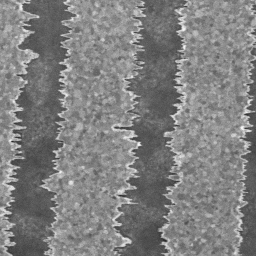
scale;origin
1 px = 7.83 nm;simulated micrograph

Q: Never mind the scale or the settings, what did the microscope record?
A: one or a few lines or trenches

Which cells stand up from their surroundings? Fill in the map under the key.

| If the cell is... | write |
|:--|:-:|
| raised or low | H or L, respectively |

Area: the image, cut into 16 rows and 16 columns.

HHLLHHHHHLLHHHHH
HHLLHHHHHLLHHHHH
HLLLHHHHHLLHHHHH
HHLLHHHHHLLHHHHH
HLLLHHHHLLLHHHHH
HLLLHHHHLLLHHHHH
HLLLHHHHLLLHHHHH
HLLLHHHHLLLHHHHL
HLLLHHHHLLLHHHHL
HLLLHHHHLLLHHHHL
HLLLHHHHLLLHHHHL
HLLHHHHHLLLHHHHL
HLLHHHHHLLLHHHHL
LLLHHHHLLLLHHHHL
HLLHHHHLLLHHHHHL
HLLHHHHHLLHHHHHL